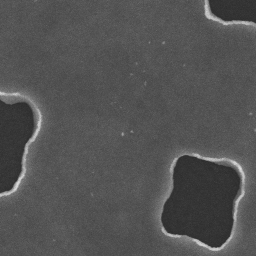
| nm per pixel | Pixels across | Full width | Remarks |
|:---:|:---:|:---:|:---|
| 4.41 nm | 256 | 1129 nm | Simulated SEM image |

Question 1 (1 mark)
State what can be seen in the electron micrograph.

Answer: holes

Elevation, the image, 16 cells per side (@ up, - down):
@@@@@@@@@@@@@---
@@@@@@@@@@@@@@@@
@@@@@@@@@@@@@@@@
@@@@@@@@@@@@@@@@
@@@@@@@@@@@@@@@@
@@@@@@@@@@@@@@@@
--@@@@@@@@@@@@@@
--@@@@@@@@@@@@@@
--@@@@@@@@@@@@@@
-@@@@@@@@@@@@@@@
-@@@@@@@@@@----@
-@@@@@@@@@@----@
@@@@@@@@@@-----@
@@@@@@@@@@-----@
@@@@@@@@@@@---@@
@@@@@@@@@@@@@@@@